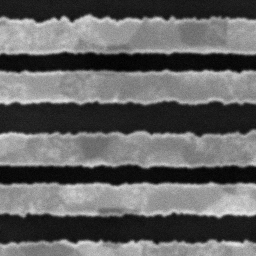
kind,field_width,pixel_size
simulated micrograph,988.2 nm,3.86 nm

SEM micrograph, lines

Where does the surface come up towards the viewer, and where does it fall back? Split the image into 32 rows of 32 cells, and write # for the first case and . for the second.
................................
................................
#..#..###.####.##.##.##########.
################################
################################
################################
########.##.###########.########
................................
................................
################################
################################
################################
################################
................................
................................
................................
.................#.............#
################################
################################
################################
################################
................................
................................
################################
################################
################################
################################
................................
................................
................................
.###############################
################################